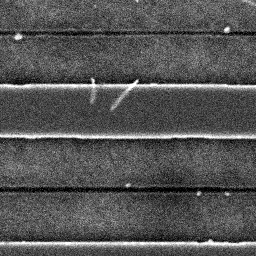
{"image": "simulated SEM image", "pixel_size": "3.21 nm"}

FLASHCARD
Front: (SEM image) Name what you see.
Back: lines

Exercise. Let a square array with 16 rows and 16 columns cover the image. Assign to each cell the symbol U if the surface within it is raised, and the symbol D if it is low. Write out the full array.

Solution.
DDDDDDDDDDDDDDDD
DDDDDDDDDDDDDDDD
DDDDDDDDDDDDDDDD
DDDDDDDDDDDDDDDD
DDDDDDDDDDDDDDDD
UUUUUUUUUUUUUUUU
UUUUUUUUUUUUUUUU
UUUUUUUUUUUUUUUU
UUUUUUUUUUUUUUUU
DDDDDDDDDDDDDDDD
DDDDDDDDDDDDDDDD
DDDDDDDDDDDDDDDD
DDDDDDDDDDDDDDDD
DDDDDDDDDDDDDDDD
DDDDDDDDDDDDDDDD
UUUUUUUUUUUUUUUU